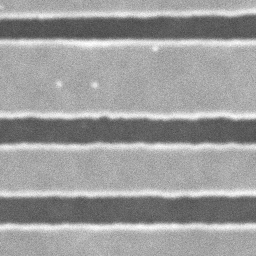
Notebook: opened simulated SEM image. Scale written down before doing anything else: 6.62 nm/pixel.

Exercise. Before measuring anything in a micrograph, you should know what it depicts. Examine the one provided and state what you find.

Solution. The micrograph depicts lines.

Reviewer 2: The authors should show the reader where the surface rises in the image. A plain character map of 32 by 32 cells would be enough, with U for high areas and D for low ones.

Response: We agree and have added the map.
UUUUUUUUUUUUUUUUUUUUUUUUUUUUUUUU
UUUUUUUUUUUUUUUUUUUUUUUUUUUUUUUU
DDDDDDDDDDDDDDDDDDDDDDDDDDDDDDDD
DDDDDDDDDDDDDDDDDDDDDDDDDDDDDDDD
DDDDDDDDDDDDDDDDDDDDDDDDDDDDDDDD
UUUUUUUUUUUUUUUUUUUUUUUUUUUUUUUU
UUUUUUUUUUUUUUUUUUUUUUUUUUUUUUUU
UUUUUUUUUUUUUUUUUUUUUUUUUUUUUUUU
UUUUUUUUUUUUUUUUUUUUUUUUUUUUUUUU
UUUUUUUUUUUUUUUUUUUUUUUUUUUUUUUU
UUUUUUUUUUUUUUUUUUUUUUUUUUUUUUUU
UUUUUUUUUUUUUUUUUUUUUUUUUUUUUUUU
UUUUUUUUUUUUUUUUUUUUUUUUUUUUUUUU
UUUUUUUUUUUUUUUUUUUUUUUUUUUUUUUU
UUUUUUUUUUUUUUUUUUUUUUUUUUUUUUUU
DDDDDDDDDDDDDDDDDDDDDDDDDDDDDDDD
DDDDDDDDDDDDDDDDDDDDDDDDDDDDDDDD
DDDDDDDDDDDDDDDDDDDDDDDDDDDDDDDD
UUUUUUUUUUUUUUUUUUUUUUUUUUUUUUUU
UUUUUUUUUUUUUUUUUUUUUUUUUUUUUUUU
UUUUUUUUUUUUUUUUUUUUUUUUUUUUUUUU
UUUUUUUUUUUUUUUUUUUUUUUUUUUUUUUU
UUUUUUUUUUUUUUUUUUUUUUUUUUUUUUUU
UUUUUUUUUUUUUUUUUUUUUUUUUUUUUUUU
UUUUDDDUUUDUUDDDDDDDUUUDUDDDUDDD
DDDDDDDDDDDDDDDDDDDDDDDDDDDDDDDD
DDDDDDDDDDDDDDDDDDDDDDDDDDDDDDDD
DDDDDDDDDDDDDDDDDDDDDDDDDDDDDDDD
UUUUUUUUUUUUUUUUUUUUUUUUUUUUUUUU
UUUUUUUUUUUUUUUUUUUUUUUUUUUUUUUU
UUUUUUUUUUUUUUUUUUUUUUUUUUUUUUUU
UUUUUUUUUUUUUUUUUUUUUUUUUUUUUUUU